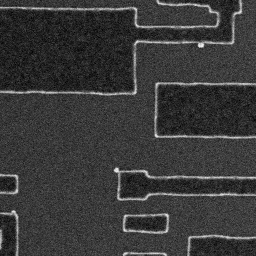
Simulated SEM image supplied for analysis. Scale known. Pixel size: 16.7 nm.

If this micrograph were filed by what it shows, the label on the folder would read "wiring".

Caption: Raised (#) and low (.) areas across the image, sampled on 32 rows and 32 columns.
....................##########..
#################..........###..
#################..........##...
#############################...
#############################...
#################........#......
#################...............
#################...............
#################...............
#################...............
#################...###.##..##..
.###.############...############
....................############
....................############
...................#############
...................#############
...................#############
................................
................................
................................
................................
...............###..............
##.............#################
##.............#################
...............####.............
................................
.#..............................
##.............######...........
##.............######...........
##........................#.....
##......................########
##......................########